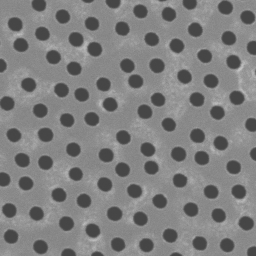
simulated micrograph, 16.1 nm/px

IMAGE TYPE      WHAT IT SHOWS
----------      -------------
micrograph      a regular array of holes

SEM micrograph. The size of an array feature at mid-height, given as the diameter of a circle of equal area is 242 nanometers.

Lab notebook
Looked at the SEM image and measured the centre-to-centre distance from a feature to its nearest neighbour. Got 396 nanometers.